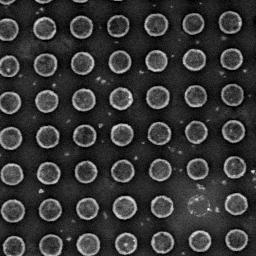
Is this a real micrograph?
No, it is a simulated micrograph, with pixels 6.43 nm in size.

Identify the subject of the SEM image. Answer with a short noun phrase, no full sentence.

a regular array of raised bodies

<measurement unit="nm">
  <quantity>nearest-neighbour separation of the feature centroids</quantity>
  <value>232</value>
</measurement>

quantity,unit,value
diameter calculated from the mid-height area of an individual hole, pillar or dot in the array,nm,136